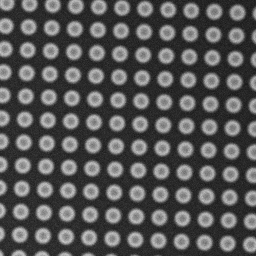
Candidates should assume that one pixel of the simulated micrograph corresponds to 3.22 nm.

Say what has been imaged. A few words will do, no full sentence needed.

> an array of small figures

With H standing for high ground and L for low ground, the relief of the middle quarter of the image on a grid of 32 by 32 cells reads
LLLLLLLLLLLLLLLLLLLLLLLLLLLLLLLL
LHHHLLLHHLLLLHHLLLLLLLLLLLLLLLLL
HHHHLLHHHHLLHHHHLLHHHLLLHHHLLLHH
HHHHLLHHHHLLHHHHLLHHHHLHHHHLLHHH
LHHLLLLHHLLLHHHLLLHHHLLHHHHLLHHH
LLLLLLLLLLLLLLLLLLLHLLLLHHLLLLHH
LLLLLLLLLLLLLLLLLLLLLLLLLLLLLLLL
HHHHLLHHHLLLHHHLLLHHLLLLLLLLLLLL
HHHHLLHHHHLLHHHLLHHHHLLHHHHLLHHH
HHHHLLHHHHLLHHHLLHHHHLLHHHHLLHHH
LLHLLLLHHLLLHHHLLLHHHLLHHHHLLHHH
LLLLLLLLLLLLLLLLLLLLLLLLLLLLLLHH
LHHLLLLLLLLLLLLLLLLLLLLLLLLLLLLL
HHHHLLHHHLLLHHHLLLHHLLLLHHLLLLLL
HHHHLLHHHHLHHHHLLHHHHLLHHHHLLHHH
HHHLLLHHHLLHHHHLLHHHHLLHHHHLLHHH
LLLLLLLHLLLLHHLLLLHHLLLHHHLLLHHH
LLLLLLLLLLLLLLLLLLLLLLLLLLLLLLHL
HHHLLLHHLLLLLLLLLLLLLLLLLLLLLLLL
HHHLLHHHHLLHHHHLLHHHLLLHHHLLLHHL
HHHLLHHHHLLHHHHLLHHHHLLHHHLLHHHH
HHHLLLHHHLLHHHHLLHHHHLLHHHLLHHHH
LLLLLLLLLLLLHHLLLLHHLLLHHHLLLHHH
LLLLLLLLLLLLLLLLLLLLLLLLLLLLLLLL
HHHLLLHHLLLLHHLLLLLLLLLLLLLLLLLL
HHHLLHHHHLLHHHHLLHHHLLLHHHLLLHHL
HHHLLHHHHLLHHHHLLHHHHLHHHHLLHHHH
HHLLLLHHLLLHHHHLLHHHLLHHHHLLHHHH
LLLLLLLLLLLLLLLLLLHLLLLHHHLLLHHH
LLLLLLLLLLLLLLLLLLLLLLLLLLLLLLLL
HHHLLHHHLLLHHHLLLLHLLLLLLLLLLLLL
HHHLLHHHHLLHHHHLHHHHLLHHHHLLHHHL